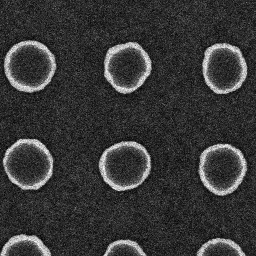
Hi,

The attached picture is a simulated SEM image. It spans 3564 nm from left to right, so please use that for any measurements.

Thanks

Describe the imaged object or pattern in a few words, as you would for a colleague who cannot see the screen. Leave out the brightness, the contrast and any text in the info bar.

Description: raised bodies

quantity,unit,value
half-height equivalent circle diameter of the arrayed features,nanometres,643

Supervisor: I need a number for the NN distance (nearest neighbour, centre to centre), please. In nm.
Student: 1350